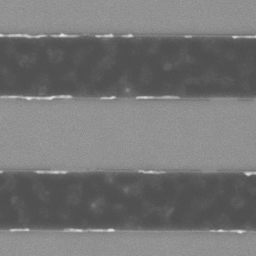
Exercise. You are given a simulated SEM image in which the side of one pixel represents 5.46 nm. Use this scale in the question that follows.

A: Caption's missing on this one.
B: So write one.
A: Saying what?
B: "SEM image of one or a few lines or trenches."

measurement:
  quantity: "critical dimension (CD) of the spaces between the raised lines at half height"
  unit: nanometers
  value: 390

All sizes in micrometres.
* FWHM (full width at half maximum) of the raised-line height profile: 0.333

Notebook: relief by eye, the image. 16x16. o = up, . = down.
................
................
oooooooooooooooo
oooooooooooooooo
oooooooooooooooo
oooooooooooooooo
................
................
................
................
................
oooooooooooooooo
oooooooooooooooo
oooooooooooooooo
..............oo
................